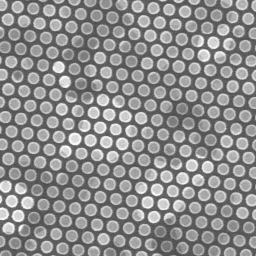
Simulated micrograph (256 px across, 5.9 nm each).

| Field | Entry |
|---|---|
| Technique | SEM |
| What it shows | a regular array of raised bodies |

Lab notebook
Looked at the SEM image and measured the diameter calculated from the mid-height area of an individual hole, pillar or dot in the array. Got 66.9 nm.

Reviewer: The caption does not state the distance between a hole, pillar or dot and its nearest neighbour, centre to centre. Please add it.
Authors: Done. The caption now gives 92.6 nm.